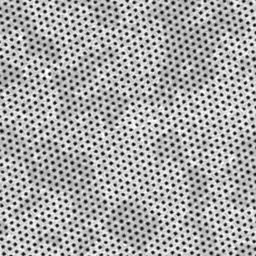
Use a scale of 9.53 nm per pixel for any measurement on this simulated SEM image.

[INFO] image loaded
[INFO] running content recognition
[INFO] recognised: a regular array of holes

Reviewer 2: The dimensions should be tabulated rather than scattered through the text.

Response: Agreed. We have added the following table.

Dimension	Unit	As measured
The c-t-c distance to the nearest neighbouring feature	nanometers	66.6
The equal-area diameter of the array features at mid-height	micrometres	0.0388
